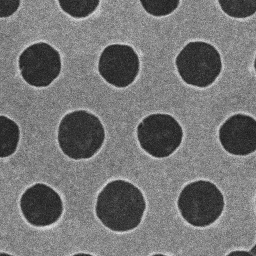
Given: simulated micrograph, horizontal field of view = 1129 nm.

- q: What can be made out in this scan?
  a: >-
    a regular array of holes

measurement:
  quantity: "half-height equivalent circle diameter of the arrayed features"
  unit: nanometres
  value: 200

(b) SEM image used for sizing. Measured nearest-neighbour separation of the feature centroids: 349 nm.